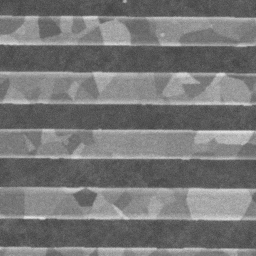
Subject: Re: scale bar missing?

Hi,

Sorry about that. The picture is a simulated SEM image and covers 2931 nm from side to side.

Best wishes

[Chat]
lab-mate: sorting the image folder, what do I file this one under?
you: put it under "lines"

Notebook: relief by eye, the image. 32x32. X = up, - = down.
--------------------------------
--------------------------------
XXXXXXXXXXXXXXXXXXXXXXXXXXXXXXXX
XXXXXXXXXXXXXXXXXXXXXXXXXXXXXXXX
XXXXXXXXXXXXXXXXXXXXXXXXXXXXXXXX
--------------------XXXXXXXXXXXX
--------------------------------
--------------------------------
--------------------------------
XXXXXXXXXXXXXXXXXXXXXXXXXXXXXXXX
XXXXXXXXXXXXXXXXXXXXXXXXXXXXXXXX
XXXXXXXXXXXXXXXXXXXXXXXXXXXXXXXX
XXXXXXXXXXXXXXXXXXXXXXXXXXXXXXXX
--------------------------------
--------------------------------
--------------------------------
XXXXXXXXXXXXXXXXXXXXXXXXXX------
XXXXXXXXXXXXXXXXXXXXXXXXXXXXXXXX
XXXXXXXXXXXXXXXXXXXXXXXXXXXXXXXX
XXXXXXXXXXXXXXXXXXXXXXXXXXXXXXXX
--------------------------------
--------------------------------
--------------------------------
--------------------------------
XXXXXXXXXXXXXXXXXXXXXXXXXXXXXXXX
XXXXXXXXXXXXXXXXXXXXXXXXXXXXXXXX
XXXXXXXXXXXXXXXXXXXXXXXXXXXXXXXX
--------------------------------
--------------------------------
--------------------------------
--------------------------------
XXXXXXXXXXXXXXXXXXXXXXXXXXXXXXXX